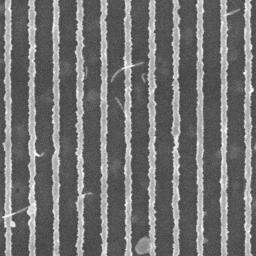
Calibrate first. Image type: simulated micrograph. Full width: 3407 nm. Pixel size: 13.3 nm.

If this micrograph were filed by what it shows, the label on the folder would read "parallel lines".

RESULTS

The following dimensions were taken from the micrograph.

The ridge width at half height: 76.5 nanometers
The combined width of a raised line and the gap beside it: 319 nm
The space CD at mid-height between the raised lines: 244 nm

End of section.